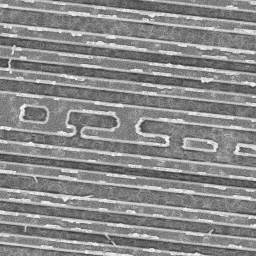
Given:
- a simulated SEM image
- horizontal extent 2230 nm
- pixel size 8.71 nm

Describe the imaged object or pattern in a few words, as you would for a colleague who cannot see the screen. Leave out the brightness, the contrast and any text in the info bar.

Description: parallel lines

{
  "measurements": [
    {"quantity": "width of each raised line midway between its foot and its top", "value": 99.6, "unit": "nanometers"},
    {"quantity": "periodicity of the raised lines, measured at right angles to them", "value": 23.6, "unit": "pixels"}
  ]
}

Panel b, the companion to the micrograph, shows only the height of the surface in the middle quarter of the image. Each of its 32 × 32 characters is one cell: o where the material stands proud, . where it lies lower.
....oooooooooooooooooooooooooo..
.............ooooooooooooooooooo
......................oooooooooo
ooooo..........................o
ooooooooooooooo.................
...ooooooooooooooooooooooo......
............oooooooooooooooooooo
.....................ooooooooooo
..............................oo
ooooooooo.......................
ooooooooooooooooo...............
oooooooooooooooooooooooooo......
o.........oooooooooooooooooooooo
o............ooooooooooooooooooo
o............oooooo.........oooo
oo...........oooooo.............
ooo..oooooo.ooooooo.............
ooo.oooooooooooooooo............
........oooooooooooooooooo......
.................ooooooooo....oo
..............................oo
oooo............................
oooooooooooooo..................
oooooooooooooooooooooo..........
......ooooooooooooooooooooooooo.
................oooooooooooooooo
ooo.....................oooooooo
oooooooooooo....................
ooooooooooooooooooooo...........
.......ooooooooooooooooooooooo..
................oooooooooooooooo
..........................oooooo